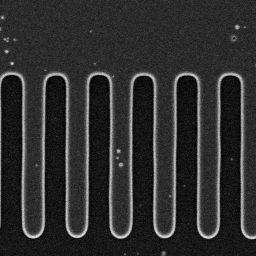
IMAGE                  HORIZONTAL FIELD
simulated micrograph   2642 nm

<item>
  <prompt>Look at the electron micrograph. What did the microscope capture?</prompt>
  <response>groups of lines, slits or small figures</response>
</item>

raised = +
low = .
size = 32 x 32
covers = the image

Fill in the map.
++++++++++++++++++++++++++++++++
++++++++++++++++++++++++++++++++
++++++++++++++++++++++++++++++++
++++++++++++++++++++++++++++++++
++++++++++++++++++++++++++++++++
++++++++++++++++++++++++++++++++
++++++++++++++++++++++++++++++++
++++++++++++++++++++++++++++++++
++++++++++++++++++++++++++++++++
+.++++..++++.++++..++++.++++..++
...+++..+++...+++..+++...++...++
...++...+++...++...+++...++...++
...++...+++...++...+++...++...++
...++...+++...++...+++...++...++
...++...+++...++...+++...++...++
...++...+++...++...+++...++...++
...++...+++...++...+++...++...++
...++...+++...++...+++...++...++
...++...+++...++...+++...++...++
...++...+++...++...+++...++...++
...++...+++...++...+++...++...++
...++...+++...++...+++...++...++
...++...+++...++...+++...++...++
...++...+++...++...+++...++...++
...++...+++...++...+++...++...++
...++...+++...++...+++...++...++
...++...+++...++...+++...++...++
...++...+++...++...+++...++...++
...++...+++...++...+++...++...++
....+....+.....+....+....++....+
................................
................................